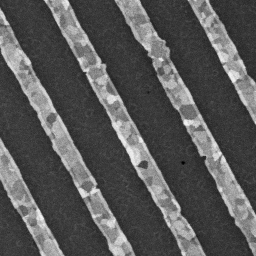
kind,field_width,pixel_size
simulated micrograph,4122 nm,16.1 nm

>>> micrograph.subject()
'one or a few lines or trenches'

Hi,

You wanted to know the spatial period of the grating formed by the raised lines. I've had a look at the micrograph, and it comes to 1000 nm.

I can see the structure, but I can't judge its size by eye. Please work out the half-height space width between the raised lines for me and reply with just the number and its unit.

45.7 px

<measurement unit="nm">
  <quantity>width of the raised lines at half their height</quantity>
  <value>268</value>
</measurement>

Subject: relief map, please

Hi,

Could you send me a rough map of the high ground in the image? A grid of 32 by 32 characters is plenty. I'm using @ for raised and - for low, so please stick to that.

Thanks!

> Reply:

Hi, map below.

------@@@------@@-------@@------
-------@@------@@@-------@@-----
@------@@-------@@@------@@-----
@-------@@-------@@-------@@----
@@------@@@------@@@------@@----
@@-------@@-------@@-------@@---
@@@------@@@-------@@------@@@--
-@@-------@@-------@@-------@@--
-@@@------@@@------@@@------@@--
--@@-------@@-------@@-------@@-
---@@------@@@------@@@------@@@
---@@@------@@-------@@-------@@
----@@-------@@------@@@------@@
-----@@------@@-------@@-------@
-----@@-------@@-------@@-------
-----@@@------@@@------@@@------
------@@-------@@-------@@------
-------@@------@@@------@@@-----
-------@@-------@@-------@@-----
@-------@@-------@@-------@@----
@@------@@-------@@-------@@----
@@-------@@------@@@------@@@---
@@@------@@@------@@-------@@---
-@@-------@@-------@@------@@@--
-@@@------@@@------@@@------@@--
--@@-------@@-------@@------@@@-
---@@------@@@------@@-------@@@
---@@-------@@-------@@-------@@
----@@-------@@------@@@------@@
----@@-------@@-------@@-------@
-----@@-------@@------@@@------@
-----@@@------@@@------@@-------